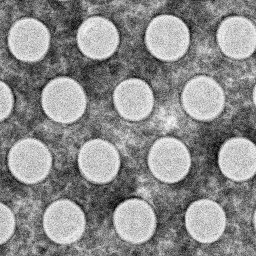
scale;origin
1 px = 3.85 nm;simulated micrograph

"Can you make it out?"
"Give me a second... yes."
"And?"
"a regular array of raised bodies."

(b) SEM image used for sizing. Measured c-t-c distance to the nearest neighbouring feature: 268 nm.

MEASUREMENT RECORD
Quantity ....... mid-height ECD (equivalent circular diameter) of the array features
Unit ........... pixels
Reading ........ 43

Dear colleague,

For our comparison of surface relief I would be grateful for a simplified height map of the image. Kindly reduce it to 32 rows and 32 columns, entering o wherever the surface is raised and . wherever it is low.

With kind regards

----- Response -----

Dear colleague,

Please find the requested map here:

................................
................................
...o.......oo......oooo.....ooo.
.ooooo....oooo....ooooo....ooooo
.ooooo....ooooo...oooooo...ooooo
.ooooo....ooooo...ooooo....ooooo
..oooo....oooo.....oooo.....oooo
...oo................o..........
................................
................................
o.....oooo.....ooo.....oooo.....
o....ooooo....ooooo....ooooo....
oo...oooooo...ooooo....ooooo....
oo...oooooo....oooo....ooooo....
o.....oooo.....ooo......ooo.....
................................
................................
...oo......oo.......oo.......oo.
..oooo....oooo.....oooo.....oooo
.ooooo....ooooo....ooooo...ooooo
.ooooo....ooooo....ooooo...ooooo
.ooooo....ooooo....oooo.....oooo
..ooo......ooo......oo.......oo.
................................
................................
......ooo......ooo......ooo.....
o.....oooo....ooooo....ooooo....
oo...oooooo...ooooo....ooooo....
oo...oooooo...ooooo....ooooo....
o.....oooo.....oooo.....oooo....
................................
................................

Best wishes